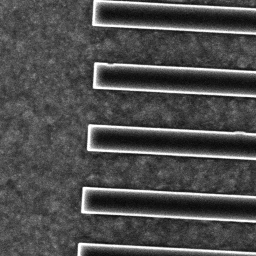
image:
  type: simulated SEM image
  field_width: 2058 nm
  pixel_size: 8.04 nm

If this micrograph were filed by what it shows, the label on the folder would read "parallel lines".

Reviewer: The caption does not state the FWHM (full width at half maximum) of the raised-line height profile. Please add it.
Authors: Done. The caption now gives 201 nm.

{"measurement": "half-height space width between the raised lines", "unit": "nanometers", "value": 301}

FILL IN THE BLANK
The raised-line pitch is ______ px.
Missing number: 62.5